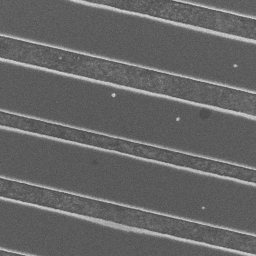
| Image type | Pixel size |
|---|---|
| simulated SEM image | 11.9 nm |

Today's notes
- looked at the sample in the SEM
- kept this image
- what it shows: lines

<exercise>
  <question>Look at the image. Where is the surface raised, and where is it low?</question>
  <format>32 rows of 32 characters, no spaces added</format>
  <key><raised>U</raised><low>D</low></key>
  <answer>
UUUUUUUUUUUUDDDDDDDDDDDDUUUUUUUU
UUUUUUUUUUUUUUUUDDDDDDDDDDDDUUUU
UUUUUUUUUUUUUUUUUUUUDDDDDDDDDDDD
UUUUUUUUUUUUUUUUUUUUUUUUUDDDDDDD
UUUUUUUUUUUUUUUUUUUUUUUUUUUUUDDD
DDDDDUUUUUUUUUUUUUUUUUUUUUUUUUUU
DDDDDDDDDUUUUUUUUUUUUUUUUUUUUUUU
UDDDDDDDDDDDDDUUUUUUUUUUUUUUUUUU
UUUUUDDDDDDDDDDDDDUUUUUUUUUUUUUU
UUUUUUUUUUDDDDDDDDDDDDUUUUUUUUUU
UUUUUUUUUUUUUUDDDDDDDDDDDDDUUUUU
UUUUUUUUUUUUUUUUUUDDDDDDDDDDDDDU
UUUUUUUUUUUUUUUUUUUUUUUDDDDDDDDD
UUUUUUUUUUUUUUUUUUUUUUUUUUUDDDDD
DDDUUUUUUUUUUUUUUUUUUUUUUUUUUUUD
DDDDDDDUUUUUUUUUUUUUUUUUUUUUUUUU
UUUDDDDDDDDUUUUUUUUUUUUUUUUUUUUU
UUUUUUUUDDDDDDDDUUUUUUUUUUUUUUUU
UUUUUUUUUUUUDDDDDDDDUUUUUUUUUUUU
UUUUUUUUUUUUUUUUUDDDDDDDUUUUUUUU
UUUUUUUUUUUUUUUUUUUUUDDDDDDDDUUU
UUUUUUUUUUUUUUUUUUUUUUUUUDDDDDDD
DUUUUUUUUUUUUUUUUUUUUUUUUUUUUUDD
DDDDDDUUUUUUUUUUUUUUUUUUUUUUUUUU
DDDDDDDDDDUUUUUUUUUUUUUUUUUUUUUU
UUUUDDDDDDDDDDUUUUUUUUUUUUUUUUUU
UUUUUUUUDDDDDDDDDDDUUUUUUUUUUUUU
UUUUUUUUUUUUDDDDDDDDDDDUUUUUUUUU
UUUUUUUUUUUUUUUUDDDDDDDDDDDDUUUU
UUUUUUUUUUUUUUUUUUUUUDDDDDDDDDDD
UUUUUUUUUUUUUUUUUUUUUUUUUUDDDDDD
DUUUUUUUUUUUUUUUUUUUUUUUUUUUUUDD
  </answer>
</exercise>